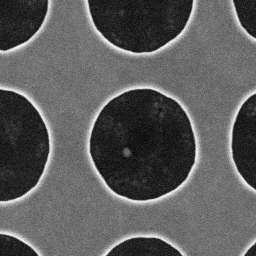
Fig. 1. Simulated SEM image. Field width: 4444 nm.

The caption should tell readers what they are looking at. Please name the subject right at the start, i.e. holes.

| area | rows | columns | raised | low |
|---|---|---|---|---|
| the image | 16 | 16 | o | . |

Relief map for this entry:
...ooo......ooo.
...ooo......ooo.
..ooooo....ooooo
oooooooooooooooo
oooooooooooooooo
oooooooooooooooo
..ooooo....oooo.
...ooo......ooo.
...ooo......oo..
...ooo......oo..
...ooo......ooo.
..ooooo....ooooo
.ooooooo.ooooooo
oooooooooooooooo
oooooooooooooooo
..ooooo....ooooo